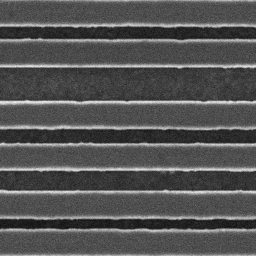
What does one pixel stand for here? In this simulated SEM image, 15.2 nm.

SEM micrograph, lines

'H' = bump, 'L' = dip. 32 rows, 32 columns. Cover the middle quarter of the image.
HHHHHHHHHHHHHHHHHHHHHHHHHHHHHHHH
LLLLLLLLLLLLLLLLLLLLLLLLLLLLLLLL
LLLLLLLLLLLLLLLLLLLLLLLLLLLLLLLL
LLLLLLLLLLLLLLLLLLLLLLLLLLLLLLLL
LLLLLLLLLLLLLLLLLLLLLLLLLLLLLLLL
LLLLLLLLLLLLLLLLLLLLLLLLLLLLLLLL
LLLLLLLLLLLLLLLLLLLLLLLLLLLLLLLL
LLLLLLLLLLLLLLLLLLLLLLLLLLLLLLLL
LLLLLLLLLLLLLLLLLLLLLLLLLLLLLLLL
HHHLLLHHHHHHHHHLHHHHHHHHHHHHHHHH
HHHHHHHHHHHHHHHHHHHHHHHHHHHHHHHH
HHHHHHHHHHHHHHHHHHHHHHHHHHHHHHHH
HHHHHHHHHHHHHHHHHHHHHHHHHHHHHHHH
HHHHHHHHHHHHHHHHHHHHHHHHHHHHHHHH
HHHHHHHHHHHHHHHHHHHHHHHHHHHHHHHH
HHHHHHHHHHHHHHHHHHHHHHHHHHHHHHHH
LLLLLLLLLLLLLLLLLLLLLLLLLLLLLLLL
LLLLLLLLLLLLLLLLLLLLLLLLLLLLLLLL
LLLLLLLLLLLLLLLLLLLLLLLLLLLLLLLL
LLLLLLLLLLLLLLLLLLLLLLLLLLLLLLLL
HHHHHHHHHHHHHHHHHHHHHHHHHHHHHHHH
HHHHHHHHHHHHHHHHHHHHHHHHHHHHHHHH
HHHHHHHHHHHHHHHHHHHHHHHHHHHHHHHH
HHHHHHHHHHHHHHHHHHHHHHHHHHHHHHHH
HHHHHHHHHHHHHHHHHHHHHHHHHHHHHHHH
HHHHHHHHHHHHHHHHHHHHHHHHHHHHHHHH
HHHHHHHHHHHHHHHHHHHHHHHHHHHHHHHH
LLLLLLLLLLLLLLLLLLLLLLLLLLLLLLLL
LLLLLLLLLLLLLLLLLLLLLLLLLLLLLLLL
LLLLLLLLLLLLLLLLLLLLLLLLLLLLLLLL
LLLLLLLLLLLLLLLLLLLLLLLLLLLLLLLL
LLLLLLLLLLLLLLLLLLLLLLLLLLLLLLLL